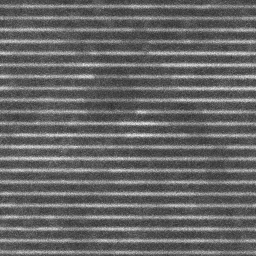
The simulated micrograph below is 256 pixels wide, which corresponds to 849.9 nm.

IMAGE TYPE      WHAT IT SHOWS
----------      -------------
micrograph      parallel lines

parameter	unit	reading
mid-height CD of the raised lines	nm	5.8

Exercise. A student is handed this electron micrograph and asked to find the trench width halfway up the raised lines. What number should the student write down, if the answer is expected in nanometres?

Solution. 32.4